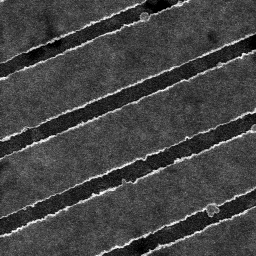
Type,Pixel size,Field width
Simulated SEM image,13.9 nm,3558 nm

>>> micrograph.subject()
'one or a few lines or trenches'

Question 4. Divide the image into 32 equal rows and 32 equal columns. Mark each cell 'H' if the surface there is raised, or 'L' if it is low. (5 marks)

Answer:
HHHHHHHHHHHHHHHHHHLLLLHHHHHHHHHH
HHHHHHHHHHHHHHHLLLLLHHHHHHHHHHHH
HHHHHHHHHHHHHLLLLHHHHHHHHHHHHHHH
HHHHHHHHHHLLLLLHHHHHHHHHHHHHHHHH
HHHHHHHHLLLLLHHHHHHHHHHHHHHHHHHL
HHHHHHLLLLHHHHHHHHHHHHHHHHHHHLLL
HHHLLLLLHHHHHHHHHHHHHHHHHHHLLLLH
HLLLLLHHHHHHHHHHHHHHHHHHLLLLLHHH
LLLHHHHHHHHHHHHHHHHHHHLLLLLHHHHH
LHHHHHHHHHHHHHHHHHHLLLLLHHHHHHHH
HHHHHHHHHHHHHHHHHLLLLLHHHHHHHHHH
HHHHHHHHHHHHHHHLLLLHHHHHHHHHHHHH
HHHHHHHHHHHHLLLLLHHHHHHHHHHHHHHH
HHHHHHHHHHLLLLLHHHHHHHHHHHHHHHHH
HHHHHHHLLLLLLHHHHHHHHHHHHHHHHHLL
HHHHHLLLLLHHHHHHHHHHHHHHHHHHLLLL
HHHLLLLLHHHHHHHHHHHHHHHHHHLLLLLH
HLLLLHHHHHHHHHHHHHHHHHHLLLLLLHHH
LLLHHHHHHHHHHHHHHHHHHLLLLLHHHHHH
LHHHHHHHHHHHHHHHHHHLLLLLHHHHHHHH
HHHHHHHHHHHHHHHHLLLLLHHHHHHHHHHH
HHHHHHHHHHHHHHLLLLLHHHHHHHHHHHHH
HHHHHHHHHHHLLLLLLHHHHHHHHHHHHHHH
HHHHHHHHHLLLLLHHHHHHHHHHHHHHHHHH
HHHHHHHLLLLHHHHHHHHHHHHHHHHHHHLL
HHHHLLLLLHHHHHHHHHHHHHHHHHHHLLLL
HHLLLLLHHHHHHHHHHHHHHHHHHLHLLLHH
LLLLHHHHHHHHHHHHHHHHHHHLLLLLHHHH
LLHHHHHHHHHHHHHHHHHHLLLLLLHHHHHH
HHHHHHHHHHHHHHHHHHLLLLLHHHHHHHHH
HHHHHHHHHHHHHHHHLLLLLHHHHHHHHHHH
HHHHHHHHHHHHHLLLLLHHHHHHHHHHHHHH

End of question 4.